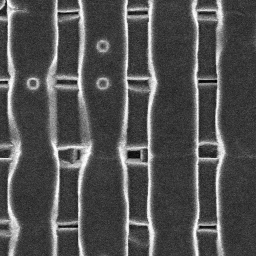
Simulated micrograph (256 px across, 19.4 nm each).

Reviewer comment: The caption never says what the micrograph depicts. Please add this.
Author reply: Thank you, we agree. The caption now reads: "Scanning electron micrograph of wiring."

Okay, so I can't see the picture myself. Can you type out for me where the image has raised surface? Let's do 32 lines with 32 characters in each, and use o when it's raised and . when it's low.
.oooooo...oooooo...ooooo...ooooo
.oooooo...oooooo...ooooo...ooooo
.oooooo...oooooo...oooooo..ooooo
.oooooo...oooooo...oooooo..ooooo
.oooooo...oooooo...oooooo..ooooo
.oooooo...oooooo...oooooo..ooooo
.oooooo...oooooo...oooooo..ooooo
.oooooo...oooooo...oooooo..ooooo
.oooooo...oooooo...oooooo..ooooo
.ooooo....oooooo...ooooo...ooooo
.ooooo....oooooo...oooooo..ooooo
.ooooo....oooooo...oooooo..ooooo
.oooooo...oooooo...oooooo..ooooo
.oooooo...oooooo...oooooo..ooooo
.oooooo...oooooo...oooooo..ooooo
.oooooo....ooooo...oooooo..ooooo
..ooooo....ooooo...oooooo..ooooo
..ooooo....ooooo...oooooo..ooooo
..ooooo....oooo....oooooo...oooo
..ooooo....oooo....oooooo...oooo
..ooooo...oooooo...oooooo..ooooo
.oooooo...oooooo...oooooo..ooooo
.oooooo...oooooo...oooooo..ooooo
.oooooo...oooooo...oooooo..ooooo
.oooooo...oooooo...oooooo..ooooo
.oooooo...oooooo...oooooo..ooooo
.oooooo...oooooo...oooooo..ooooo
..ooooo...oooooo...oooooo..ooooo
..ooooo...oooooo...ooooo...ooooo
..ooooo...oooooo...ooooo...ooooo
..ooooo...oooooo...ooooo...ooooo
.oooooo...oooooo...oooooo..ooooo